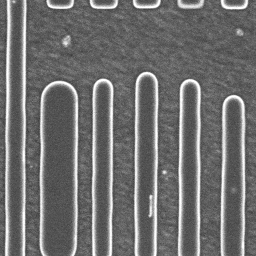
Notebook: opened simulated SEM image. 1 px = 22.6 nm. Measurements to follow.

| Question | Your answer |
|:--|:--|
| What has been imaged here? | groups of lines, slits or small figures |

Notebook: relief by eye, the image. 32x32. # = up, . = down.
.##...###..####..###...##...###.
.##.............................
.##.............................
.##.............................
.##.............................
.##.............................
.##.............................
.##.............................
.##.............................
.##...............#.............
.##...###...##...###...##.......
.##..####...##...###...##.......
.##..#####..##...###...##...##..
.##..#####..##...###...##...##..
.##..#####..##...###...##...##..
.##..#####..##...###...##...##..
.##..#####..##...###...##...##..
.##..#####..##...###...##...##..
.##..#####..##...###...##...##..
.##..####...##...###...##...##..
.##..####...##...###...##...##..
.##..####...##...###...##...###.
.##..####...##...###...##...###.
.##..#####..##...##....##...###.
.##..####...##...##....##...###.
.##..#####..##...##....##...###.
.##..#####..##...##....##...##..
.##..#####..##...##....##...###.
.##..####...##...##...###...###.
.##..####...##...##...###...##..
.##..####...##...##...###...##..
.##..####...##...##...###...##..